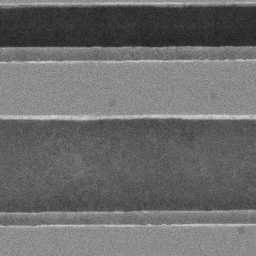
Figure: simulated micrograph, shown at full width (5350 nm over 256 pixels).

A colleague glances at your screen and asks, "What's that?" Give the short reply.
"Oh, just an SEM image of lines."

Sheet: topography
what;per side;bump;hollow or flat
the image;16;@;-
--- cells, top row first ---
----------------
----------------
----------------
@@@@@@@@@@@@@@@@
@@@@@@@@@@@@@@@@
@@@@@@@@@@@@@@@@
@@@@@@@@@@@@@@@@
----------------
----------------
----------------
----------------
----------------
----------------
@@@@@@@@@@@@@@@@
@@@@@@@@@@@@@@@@
@@@@@@@@@@@@@@@@